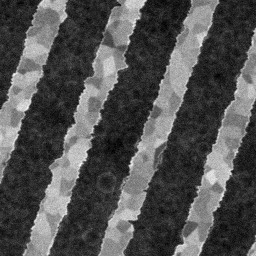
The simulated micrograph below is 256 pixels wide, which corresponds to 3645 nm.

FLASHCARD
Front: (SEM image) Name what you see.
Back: one or a few lines or trenches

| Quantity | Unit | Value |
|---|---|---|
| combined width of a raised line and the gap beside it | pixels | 70.2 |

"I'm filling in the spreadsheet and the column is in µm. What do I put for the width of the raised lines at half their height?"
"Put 0.34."